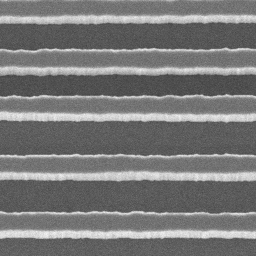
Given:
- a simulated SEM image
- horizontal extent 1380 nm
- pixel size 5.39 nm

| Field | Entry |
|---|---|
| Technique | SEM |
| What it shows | lines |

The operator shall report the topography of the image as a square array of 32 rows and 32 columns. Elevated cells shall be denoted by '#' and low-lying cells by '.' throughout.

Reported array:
################################
################################
########################.#..####
................................
................................
................................
################################
################################
################################
................................
................................
................................
################################
################################
################################
................................
................................
................................
................................
##################.#..##########
################################
################################
................................
................................
................................
................................
.........#.####.##..............
################################
################################
............##...#.............#
................................
................................